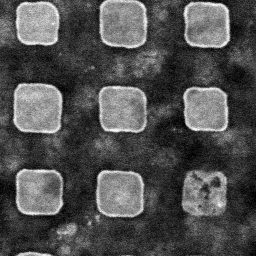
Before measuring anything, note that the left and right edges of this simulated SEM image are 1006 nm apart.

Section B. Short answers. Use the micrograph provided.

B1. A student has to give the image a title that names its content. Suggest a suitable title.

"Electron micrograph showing raised bodies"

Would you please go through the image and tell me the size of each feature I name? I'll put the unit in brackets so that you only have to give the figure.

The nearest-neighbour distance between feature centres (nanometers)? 328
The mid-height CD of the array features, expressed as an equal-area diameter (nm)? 194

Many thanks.